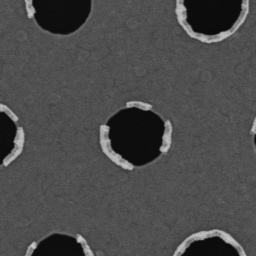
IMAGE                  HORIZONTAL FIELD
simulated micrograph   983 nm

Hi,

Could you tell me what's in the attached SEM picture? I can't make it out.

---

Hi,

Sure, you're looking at holes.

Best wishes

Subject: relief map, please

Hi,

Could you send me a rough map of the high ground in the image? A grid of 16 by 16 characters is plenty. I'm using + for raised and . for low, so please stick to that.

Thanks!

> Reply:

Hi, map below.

++....++++++...+
++...+++++++...+
++++++++++++++++
++++++++++++++++
++++++++++++++++
++++++++++++++++
++++++++++++++++
.++++++...++++++
.++++++...++++++
.++++++...++++++
++++++++++++++++
++++++++++++++++
++++++++++++++++
++++++++++++++++
++++++++++++++++
++...+++++++...+